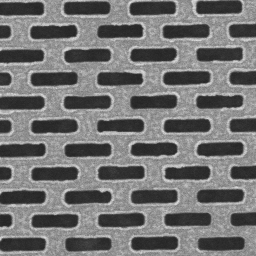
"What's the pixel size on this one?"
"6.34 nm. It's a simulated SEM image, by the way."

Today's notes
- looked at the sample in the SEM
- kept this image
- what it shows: a regular array of holes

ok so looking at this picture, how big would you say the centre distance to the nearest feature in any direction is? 256 nanometers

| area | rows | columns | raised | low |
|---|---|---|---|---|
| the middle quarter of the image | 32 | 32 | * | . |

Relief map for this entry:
********************************
********************************
...******..........******.......
...*****............*****.......
...*****............*****.......
********************************
********************************
********************************
...........******...........****
............*****...........****
............*****...........****
********************************
********************************
********************************
...******...........*****.......
...*****............*****.......
...*****............*****.......
********************************
********************************
**************************.*****
............*****...........****
............*****...........****
............*****...........****
********************************
********************************
****************...************.
...******...........*****.......
...******...........*****.......
...******...........*****.......
********************************
********************************
******..*****************...****